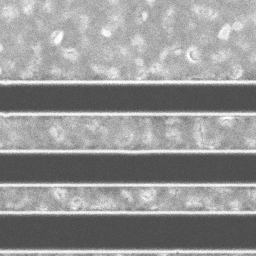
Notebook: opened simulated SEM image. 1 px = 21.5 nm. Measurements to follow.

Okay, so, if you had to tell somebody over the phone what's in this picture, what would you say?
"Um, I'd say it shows one or a few lines or trenches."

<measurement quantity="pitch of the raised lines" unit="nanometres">1440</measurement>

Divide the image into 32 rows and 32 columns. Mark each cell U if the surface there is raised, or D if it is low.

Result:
DDDDDDDDDDDDDDDDDDDDDDDDDDDDDDDD
DDDDDDDDDDDDDDDDDDDDDDDDDDDDDDDD
DDDDDDDDDDDDDDDDDDDDDDDDDDDDDDDD
DDDDDDDDDDDDDDDDDDDDDDDDDDDDDDDD
DDDDDDDDDDDDDDDDDDDDDDDDDDDDDDDD
DDDDDDDDDDDDDDDDDDDDDDDDDDDDDDDD
DDDDDDDDDDDDDDDDDDDDDDDDDDDDDDDD
DDDDDDDDDDDDDDDDDDDDDDDDDDDDDDDD
DDDDDDDDDDDDDDDDDDDDDDDDDDDDDDDD
DDDDDDDDDDDDDDDDDDDDDDDDDDDDDDDD
UUUUUUUUUUUUUUUUUUUUUUUUUUUUUUUU
UUUUUUUUUUUUUUUUUUUUUUUUUUUUUUUU
UUUUUUUUUUUUUUUUUUUUUUUUUUUUUUUU
UUUUUUUUUUUUUUUUUUUUUUUUUUUUUUUU
DDDDDDDDDDDDDDDDDDDDDDDDDDDDDDDD
DDDDDDDDDDDDDDDDDDDDDDDDDDDDDDDD
DDDDDDDDDDDDDDDDDDDDDDDDDDDDDDDD
DDDDDDDDDDDDDDDDDDDDDDDDDDDDDDDD
DDDDDDDDDDDDDDDDDDDDDDDDDDDDDDDD
UUUUUUUUUUUUUUUUUUUUUUUUUUUUUUUU
UUUUUUUUUUUUUUUUUUUUUUUUUUUUUUUU
UUUUUUUUUUUUUUUUUUUUUUUUUUUUUUUU
UUUUUUUUUUUUUUUUUUUUUUUUUUUUUUUU
DDDDDDDDDDDDDDDDDDDDDDDDDDDDDDDD
DDDDDDDDDDDDDDDDDDDDDDDDDDDDDDDD
DDDDDDDDDDDDDDDDDDDDDDDDDDDDDDDD
DDDDDDDDDDDDDDDDDDDDDDDDDDDDDDDD
UUUUUUUUUUUUUUUUUUUUUUUUUUUUUUUU
UUUUUUUUUUUUUUUUUUUUUUUUUUUUUUUU
UUUUUUUUUUUUUUUUUUUUUUUUUUUUUUUU
UUUUUUUUUUUUUUUUUUUUUUUUUUUUUUUU
DDDDDDDDDDDDDDDDDDDDDDDDDDDDDDDD